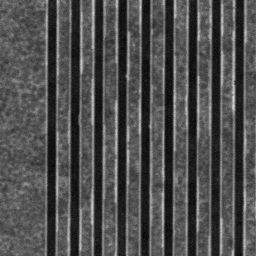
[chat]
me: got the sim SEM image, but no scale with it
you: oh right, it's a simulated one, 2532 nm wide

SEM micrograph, parallel lines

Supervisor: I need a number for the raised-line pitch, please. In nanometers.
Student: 232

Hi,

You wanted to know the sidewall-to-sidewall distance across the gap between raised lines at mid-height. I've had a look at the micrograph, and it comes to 0.103 um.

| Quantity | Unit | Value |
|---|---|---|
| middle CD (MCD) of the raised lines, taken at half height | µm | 0.131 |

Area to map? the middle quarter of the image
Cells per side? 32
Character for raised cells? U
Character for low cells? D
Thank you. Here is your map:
UDDDUUUDDDUUUDDDUUUDDDUUUDDDUUUD
UDDDUUUDDDUUUDDDUUUDDDUUUDDDUUUD
UDDDUUUDDDUUUDDDUUUDDDUUUDDDUUUD
UDDDUUUDDDUUUDDDUUUDDDUUUDDDUUUD
UDDDUUUDDDUUUDDDUUUDDDUUUDDDUUUD
UDDDUUUDDDUUUDDDUUUDDDUUUDDDUUUD
UDDDUUUDDDUUUDDDUUUDDDUUUDDDUUUD
UDDDUUUDDDUUUDDDUUUDDDUUUDDDUUUD
UDDDUUUDDDUUUDDDUUUDDDUUUDDDUUUD
UDDDUUUDDDUUUDDDUUUDDDUUUDDDUUUD
UDDDUUUDDDUUUDDDUUUDDDUUUDDDUUUD
UDDDUUUDDDUUUDDDUUUDDDUUUDDDUUUD
UDDDUUUDDDUUUDDDUUUDDDUUUDDDUUUD
UDDDUUUDDDUUUDDDUUUDDDUUUDDDUUUD
UDDDUUUDDDUUUDDDUUUDDDUUUDDDUUUD
UDDDUUUDDDUUUDDDUUUDDDUUUDDDUUUD
UDDDUUUDDDUUUDDDUUUDDDUUUDDDUUUD
UDDDUUUDDDUUUDDDUUUDDDUUUDDDUUUD
UDDDUUUDDDUUUDDDUUUDDDUUUDDDUUUD
UDDDUUUDDDUUUDDDUUUDDDUUUDDDUUUD
UDDDUUUDDDUUUDDDUUUDDDUUUDDDUUUD
UDDDUUUDDDUUUDDDUUUDDDUUUDDDUUUD
UDDDUUUDDDUUUDDDUUUDDDUUUDDDUUUD
UDDDUUUDDDUUUDDDUUUDDDUUUDDDUUUD
UDDDUUUDDDUUUDDDUUUDDDUUUDDDUUUD
UDDDUUUDDDUUUDDDUUUDDDUUUDDDUUUD
UDDDUUUDDDUUUDDDUUUDDDUUUDDDUUUD
UDDDUUUDDDUUUDDDUUUDDDUUUDDDUUUD
UDDDUUUDDDUUUDDDUUUDDDUUUDDDUUUD
UDDDUUUDDDUUUDDDUUUDDDUUUDDDUUUD
UDDDUUUDDDUUUDDDUUUDDDUUUDDDUUUD
UDDDUUUDDDUUUDDDUUUDDDUUUDDDUUUD